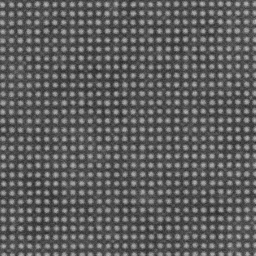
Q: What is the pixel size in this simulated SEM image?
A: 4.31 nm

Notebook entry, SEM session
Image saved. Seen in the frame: a regular array of raised bodies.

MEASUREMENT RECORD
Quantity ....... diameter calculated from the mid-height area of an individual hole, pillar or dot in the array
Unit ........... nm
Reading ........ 21.7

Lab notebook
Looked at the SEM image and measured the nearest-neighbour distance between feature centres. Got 0.036 µm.